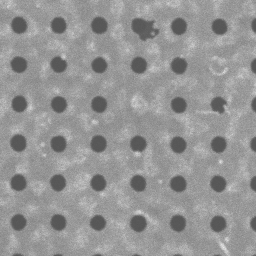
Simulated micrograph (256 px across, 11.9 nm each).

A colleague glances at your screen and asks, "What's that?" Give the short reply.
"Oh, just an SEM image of a regular array of holes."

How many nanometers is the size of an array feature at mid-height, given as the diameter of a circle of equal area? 200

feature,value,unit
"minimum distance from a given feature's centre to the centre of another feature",467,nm